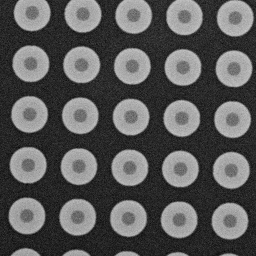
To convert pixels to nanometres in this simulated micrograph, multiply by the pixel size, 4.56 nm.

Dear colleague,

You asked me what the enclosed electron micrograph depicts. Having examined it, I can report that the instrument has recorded an array of small figures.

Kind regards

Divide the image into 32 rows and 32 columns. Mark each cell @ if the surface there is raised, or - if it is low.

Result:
--@@@@---@@@---@@@---@@@@---@@@-
--@@@@--@@@@@--@@@@--@@@@--@@@@@
--@@@@--@@@@@--@@@@--@@@@--@@@@@
---@@----@@@---@@@---@@@@---@@@-
--------------------------------
--------------------------------
--@@@@---@@@---@@@----@@----@@--
--@@@@--@@@@--@@@@@--@@@@--@@@@-
--@@@@--@@@@--@@@@@--@@@@--@@@@-
--@@@@--@@@@---@@@---@@@@--@@@@-
----------------------@@----@@--
--------------------------------
--@@@----@@-----@---------------
--@@@@--@@@@--@@@@---@@@@--@@@@-
-@@@@@--@@@@--@@@@@-@@@@@--@@@@-
--@@@@--@@@@--@@@@---@@@@--@@@@-
---@-----@@----@@@---@@@---@@@@-
--------------------------------
---@----------------------------
--@@@---@@@@---@@@---@@@----@@--
-@@@@@--@@@@--@@@@--@@@@@--@@@@-
-@@@@@--@@@@--@@@@--@@@@@--@@@@-
--@@@---@@@----@@@---@@@---@@@@-
----------------------------@@--
--------------------------------
--@@@---@@@----@@----@@@----@---
-@@@@@--@@@@--@@@@--@@@@---@@@@-
-@@@@@-@@@@@--@@@@--@@@@@--@@@@-
--@@@---@@@@--@@@@--@@@@---@@@@-
----------------@----@@----@@@--
--------------------------------
--@@@----@@----@@---------------